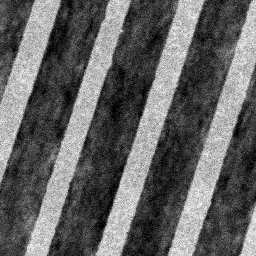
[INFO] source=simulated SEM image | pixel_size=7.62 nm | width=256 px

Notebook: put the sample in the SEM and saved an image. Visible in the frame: one or a few lines or trenches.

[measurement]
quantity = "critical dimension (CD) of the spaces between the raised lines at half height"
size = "355 nm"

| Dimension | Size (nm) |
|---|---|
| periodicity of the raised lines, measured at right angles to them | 522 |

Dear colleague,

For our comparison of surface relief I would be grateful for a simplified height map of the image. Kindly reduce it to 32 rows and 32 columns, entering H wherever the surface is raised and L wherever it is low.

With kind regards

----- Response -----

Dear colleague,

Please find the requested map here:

LLLLHHHLLLLLLLHHLLLLLLHHHLLLLLLH
LLLLHHHLLLLLLHHHLLLLLLHHHLLLLLLH
LLLLHHHLLLLLLHHHLLLLLLHHHLLLLLLH
LLLHHHLLLLLLLHHLLLLLLHHHLLLLLLHH
LLLHHHLLLLLLHHHLLLLLLHHHLLLLLLHH
LLLHHHLLLLLLHHHLLLLLLHHHLLLLLLHH
LLHHHHLLLLLLHHLLLLLLHHHLLLLLLHHH
LLHHHLLLLLLHHHLLLLLLHHHLLLLLLHHH
LLHHHLLLLLLHHHLLLLLLHHHLLLLLLHHH
LHHHLLLLLLLHHLLLLLLLHHLLLLLLHHHL
LHHHLLLLLLHHHLLLLLLHHHLLLLLLHHHL
LHHHLLLLLLHHHLLLLLLHHHLLLLLLHHHL
HHHHLLLLLLHHLLLLLLHHHLLLLLLHHHLL
HHHLLLLLLHHHLLLLLLHHHLLLLLLHHHLL
HHHLLLLLLHHHLLLLLLHHHLLLLLLHHHLL
HHHLLLLLLHHLLLLLLHHHLLLLLLHHHLLL
HHLHLLLLHHHLLLLLLHHHLLLLLLHHHLLL
HHLLLLLLHHHLLLLLLHHHLLLLLLHHHLLL
HHLLLLLLHHLLLLLLHHHLLLLLLHHHLLLL
HLLLLLLHHHLLLLLLHHHLLLLLLHHHLLLL
HLLLLLLHHHLLLLLLHHHLLLLLLHHHLLLL
HLLLLLLHHLLLLLLHHHHLLLLLHHHLLLLL
LLLLLLHHHLLLLLLHHHLLLLLLHHHLLLLL
LLLLLLHHHLLLLLLHHHLLLLLLHHHLLLLL
LLLLLLHHLLLLLLLHHLLLLLLHHHLLLLLL
LLLLLHHHLLLLLLHHHLLLLLLHHHLLLLLL
LLLLLHHHLLLLLLHHHLLLLLLHHHLLLLLL
LLLLLHHLLLLLLLHHLLLLLLHHHLLLLLLH
LLLLHHHLLLLLLHHHLLLLLLHHHLLLLLLH
LLLLHHHLLLLLLHHHLLLLLLHHHLLLLLLH
LLLLHHLLLLLLLHHHLLLLLLHHHLLLLLHH
LLLHHHLLLLLLHHHLLLLLLHHHLLLLLLHH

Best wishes